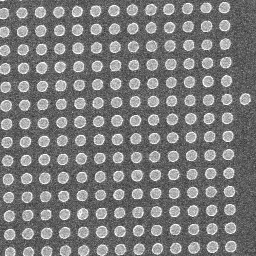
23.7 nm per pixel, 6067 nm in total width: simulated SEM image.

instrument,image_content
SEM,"a regular array of raised bodies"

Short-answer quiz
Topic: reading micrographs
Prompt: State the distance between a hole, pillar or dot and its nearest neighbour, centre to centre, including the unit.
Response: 432 nm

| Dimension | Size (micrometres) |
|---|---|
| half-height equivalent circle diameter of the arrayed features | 0.251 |